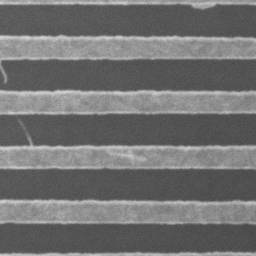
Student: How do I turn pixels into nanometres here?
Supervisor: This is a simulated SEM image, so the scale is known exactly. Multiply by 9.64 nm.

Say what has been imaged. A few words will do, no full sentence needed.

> lines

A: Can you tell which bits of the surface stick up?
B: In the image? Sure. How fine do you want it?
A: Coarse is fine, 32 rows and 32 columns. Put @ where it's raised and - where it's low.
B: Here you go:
------------------------@@-----@
--------------------------------
--------------------------------
--------------------------------
--------------------------------
@@@@@@@@@@@@@@@@@@@@@@@@@@@@@@@@
@@@@@@@@@@@@@@@@@@@@@@@@@@@@@@@@
--------------------------------
--------------------------------
--------------------------------
--------------------------------
@@-----@@@-------@@@@@@@-@-----@
@@@@@@@@@@@@@@@@@@@@@@@@@@@@@@@@
@@@@@@@@@@@@@@@@@@@@@@@@@@@@@@@@
--------------------------------
--------------------------------
--------------------------------
--------------------------------
@@@@@@@@@@@@@@@@@@@@@@@@@@@@@@@@
@@@@@@@@@@@@@@@@@@@@@@@@@@@@@@@@
@@@@@@@@@@@@@@@@@@@@@@@@@@@@@@@@
--------------------------------
--------------------------------
--------------------------------
--------------------------------
@@@@@@@@@@@@@@@@@@@@@@@@@@@@@@@@
@@@@@@@@@@@@@@@@@@@@@@@@@@@@@@@@
@@@@@@@@@@@@@@@@@@@@@@@@@@@@@@@@
--------------------------------
--------------------------------
--------------------------------
--------------------------------